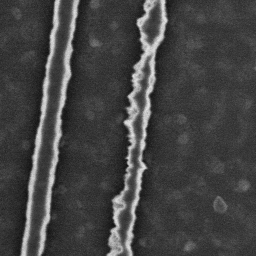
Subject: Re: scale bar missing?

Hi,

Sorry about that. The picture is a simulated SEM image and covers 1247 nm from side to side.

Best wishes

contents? one or a few lines or trenches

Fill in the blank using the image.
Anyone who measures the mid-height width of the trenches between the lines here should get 348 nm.